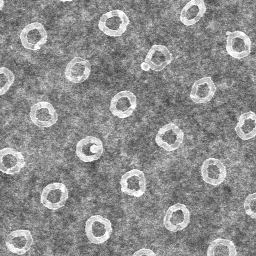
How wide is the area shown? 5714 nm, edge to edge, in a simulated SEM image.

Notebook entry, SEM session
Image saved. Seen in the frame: a regular array of ring-shaped raised bodies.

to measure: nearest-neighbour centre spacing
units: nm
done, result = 1250